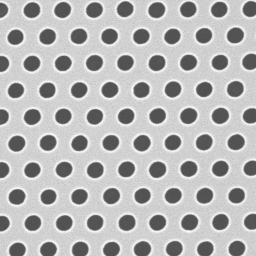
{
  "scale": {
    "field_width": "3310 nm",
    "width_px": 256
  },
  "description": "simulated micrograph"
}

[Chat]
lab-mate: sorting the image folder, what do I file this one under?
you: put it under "a regular array of holes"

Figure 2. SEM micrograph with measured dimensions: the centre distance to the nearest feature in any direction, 0.395 microns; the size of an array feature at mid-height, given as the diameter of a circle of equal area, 217 nm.